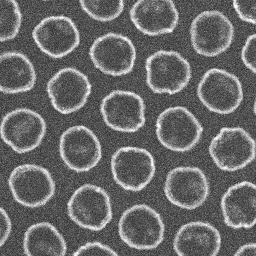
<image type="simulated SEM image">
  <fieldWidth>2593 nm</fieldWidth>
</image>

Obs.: a regular array of raised bodies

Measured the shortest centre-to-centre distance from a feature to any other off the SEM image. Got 569 nanometers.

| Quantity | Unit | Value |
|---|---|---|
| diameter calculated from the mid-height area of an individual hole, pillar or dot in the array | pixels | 41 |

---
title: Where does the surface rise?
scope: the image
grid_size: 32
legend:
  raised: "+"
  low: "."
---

++........+++++..++++........+++
++.........++++..+++++........++
++....++.........+++++...+++...+
++...++++.........+++...+++++...
+...++++++..............+++++...
.....++++...++++........++++...+
......++....+++++........++...++
+++.........+++++..++++........+
++++.........+++...++++.........
++++...+++.........++++...+++...
++++..+++++........++++..+++++..
......+++++..............+++++..
.......+++...++++........+++++..
.......++....+++++........+++...
.++++........+++++..++++........
+++++.........++++..+++++.......
+++++....++.........+++++...++..
.++++...++++........++++...++++.
..++....++++..........+....+++++
........++++..+++++........+++++
.........+++..+++++........+++..
..++++........+++++...+++.......
.+++++.........+++...+++++......
..++++....++....+....+++++...+++
..++++...++++........+++++..++++
...++....+++++........+++...++++
.........+++++..+++.........++++
+.........+++..+++++........++++
+...+++........+++++...+++......
+..++++........+++++..+++++.....
...+++++........+++...+++++.....
...+++++..++++........+++++...++